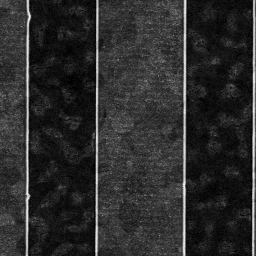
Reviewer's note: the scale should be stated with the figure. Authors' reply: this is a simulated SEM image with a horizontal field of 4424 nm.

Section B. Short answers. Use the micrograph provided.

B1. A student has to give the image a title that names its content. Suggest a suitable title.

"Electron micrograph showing one or a few lines or trenches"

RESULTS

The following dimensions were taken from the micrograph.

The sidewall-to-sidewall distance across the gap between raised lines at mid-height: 1190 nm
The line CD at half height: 1.52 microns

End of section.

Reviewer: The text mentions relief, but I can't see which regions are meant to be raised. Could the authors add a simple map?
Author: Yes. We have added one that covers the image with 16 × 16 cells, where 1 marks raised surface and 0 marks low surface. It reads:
1100001111110000
1100001111110000
1100001111110000
1100001111110000
1100001111110000
1100001111110000
1100001111110000
1100001111110000
1100001111110000
1100001111110000
1100001111110000
1100001111110000
1100001111110000
1100001111100000
1100001111100000
1100001111100000